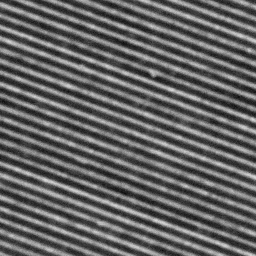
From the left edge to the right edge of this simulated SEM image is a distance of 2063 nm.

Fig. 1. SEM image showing parallel lines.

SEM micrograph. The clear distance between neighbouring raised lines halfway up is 64.3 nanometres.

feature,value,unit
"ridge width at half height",24.6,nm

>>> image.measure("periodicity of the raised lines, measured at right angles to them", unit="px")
10.6